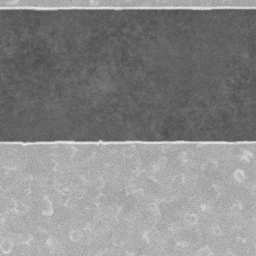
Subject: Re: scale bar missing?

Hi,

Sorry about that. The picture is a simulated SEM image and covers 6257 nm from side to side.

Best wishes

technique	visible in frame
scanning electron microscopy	one or a few lines or trenches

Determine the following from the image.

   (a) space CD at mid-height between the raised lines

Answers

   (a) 3290 nanometres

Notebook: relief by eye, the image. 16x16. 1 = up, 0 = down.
1011110000000000
0000000000000000
0000000000000000
0000000000000000
0000000000000000
0000000000000000
0000000000000000
0000000000000000
0000000000000000
1111111111111111
1111111111111111
1111111111111111
1111111111111111
1111111111111111
1111111111111111
1111111111111111